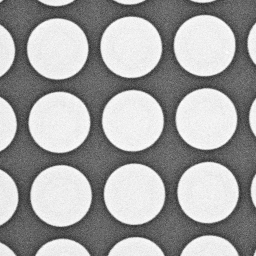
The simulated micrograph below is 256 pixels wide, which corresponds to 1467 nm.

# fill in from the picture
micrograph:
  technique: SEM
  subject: an array of small figures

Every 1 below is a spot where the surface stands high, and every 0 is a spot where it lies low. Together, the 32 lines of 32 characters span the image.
00000011000000000000000000000000
00000000000000000000000000000000
00000011000000011100000011110000
00000111110001111110001111111000
10001111111001111111001111111001
11011111111001111111001111111001
11011111111001111111001111111001
11001111111001111111001111111000
10001111110000111110000111110000
00000011100000011100000000000000
00000000000000000000000000000000
00000000000000011100000011100000
10000111110000111110000111111000
10001111111001111111001111111001
11001111111001111111001111111101
11001111111001111111001111111101
11001111111001111111001111111000
10001111110000111111000111111000
10000111100000011100000001100000
00000000000000000000000000000000
00000000000000000000000001100000
00000111110000111110000111111000
11001111111001111111000111111000
11001111111001111111101111111101
11001111111001111111101111111101
11001111111001111111000111111100
11001111111000111111000111111000
10000111110000011110000011110000
00000000000000000000000000000000
00000000000000000000000000100000
00000011110000011110000011111000
11000111111000111111000111111100